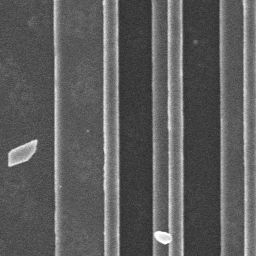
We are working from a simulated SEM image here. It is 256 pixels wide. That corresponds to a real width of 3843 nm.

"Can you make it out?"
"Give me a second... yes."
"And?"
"lines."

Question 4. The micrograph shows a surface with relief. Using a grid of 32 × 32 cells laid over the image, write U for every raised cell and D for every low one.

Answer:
DDDDDDDUUUUUUUUDDDDUUUUDDDDDUUUU
DDDDDDDUUUUUUUUDDDDUUUUDDDDDUUUU
DDDDDDDUUUUUUUUDDDDUUUUDDDDDUUUU
DDDDDDDUUUUUUUUDDDDUUUUDDDDDUUUU
DDDDDDDUUUUUUUUDDDDUUUUDDDDDUUUU
DDDDDDDUUUUUUUUDDDDUUUUDDDDDUUUU
DDDDDDDUUUUUUUUDDDDUUUUDDDDDUUUU
DDDDDDDUUUUUUUUDDDDUUUUDDDDDUUUU
DDDDDDDUUUUUUUUDDDDUUUUDDDDDUUUU
DDDDDDDUUUUUUUUDDDDUUUUDDDDDUUUU
DDDDDDDUUUUUUUUDDDDUUUUDDDDDUUUU
DDDDDDDUUUUUUUUDDDDUUUUDDDDDUUUU
DDDDDDDUUUUUUUUDDDDUUUUDDDDDUUUU
DDDDDDDUUUUUUUUDDDDUUUUDDDDDUUUU
DDDDDDDUUUUUUUUDDDDUUUUDDDDDUUUU
DDDDDDDUUUUUUUUDDDDUUUUDDDDDUUUU
DDDDDDDUUUUUUUUDDDDUUUUDDDDDUUUU
DDDDDDDUUUUUUUUDDDDUUUUDDDDDUUUU
DDDDDDDUUUUUUUUDDDDUUUUDDDDDUUUU
DDDDDDDUUUUUUUUDDDDUUUUDDDDDUUUU
DDDDDDDUUUUUUUUDDDDUUUUDDDDDUUUU
DDDDDDDUUUUUUUUDDDDUUUUDDDDDUUUU
DDDDDDDUUUUUUUUDDDDUUUUDDDDDUUUU
DDDDDDDUUUUUUUUDDDDUUUUDDDDDUUUU
DDDDDDDUUUUUUUUDDDDUUUUDDDDDUUUU
DDDDDDDUUUUUUUUDDDDUUUUDDDDDUUUU
DDDDDDDUUUUUUUUDDDDUUUUDDDDDUUUU
DDDDDDDUUUUUUUUDDDDUUUUDDDDDUUUU
DDDDDDDUUUUUUUUDDDDUUUUDDDDDUUUU
DDDDDDDUUUUUUUUDDDDUUUUDDDDDUUUU
DDDDDDDUUUUUUUUDDDDUUUUDDDDDUUUU
DDDDDDDUUUUUUUUDDDDUUUUDDDDDUUUU